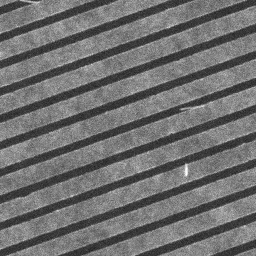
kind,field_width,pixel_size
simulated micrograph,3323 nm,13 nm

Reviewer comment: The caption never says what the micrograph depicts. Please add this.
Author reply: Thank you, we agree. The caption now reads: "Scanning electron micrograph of parallel lines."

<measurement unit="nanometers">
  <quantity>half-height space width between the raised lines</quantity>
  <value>113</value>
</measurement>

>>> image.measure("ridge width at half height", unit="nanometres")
216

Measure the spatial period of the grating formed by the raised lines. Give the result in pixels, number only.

25.4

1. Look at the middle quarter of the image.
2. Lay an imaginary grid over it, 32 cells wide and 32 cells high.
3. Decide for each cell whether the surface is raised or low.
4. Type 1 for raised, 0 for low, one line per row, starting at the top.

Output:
00000011111111111100000011111111
00011111111111100000001111111111
11111111111100000001111111111110
11111111100000001111111111110000
11111110000001111111111110000000
11110000001111111111111000000111
10000000111111111111000000111111
00000111111111111000000011111111
00111111111111000000011111111111
11111111111000000011111111111110
11111111100000011111111111110000
11111100000011111111111110000000
11100000001111111111110000000111
00000001111111111110000000111111
00001111111111111000000111111111
01111111111111000000111111111111
11111111111000000111111111111100
11111111000000011111111111000000
11111000000011111111111100000001
11000000011111111111100000001111
00000011111111111110000001111111
00011111111111110000001111111111
11111111111110000001111111111111
11111111110000000111111111111000
11111110000000111111111111000000
11110000000111111111111000000011
11000000111111111111000000011111
00000111111111111100000011111111
00011111111111100000011111111111
11111111111100000011111111111110
11111111100000001111111111110000
11111100000001111111111111000000